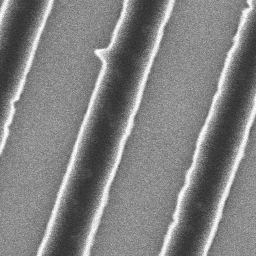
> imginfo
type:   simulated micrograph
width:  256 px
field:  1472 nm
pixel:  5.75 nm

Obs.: one or a few lines or trenches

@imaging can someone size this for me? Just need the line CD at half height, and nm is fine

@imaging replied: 250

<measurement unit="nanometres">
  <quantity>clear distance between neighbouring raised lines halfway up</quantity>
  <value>410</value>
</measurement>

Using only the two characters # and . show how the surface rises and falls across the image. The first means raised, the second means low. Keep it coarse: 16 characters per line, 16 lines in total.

###.....###....#
###....###.....#
##.....###.....#
##....####....##
##....###.....##
#.....###.....##
#.....###....###
#....###.....###
.....###.....##.
.....###....###.
....###.....###.
....###.....##..
....###....###..
...###.....###..
...###.....##...
...###....###...